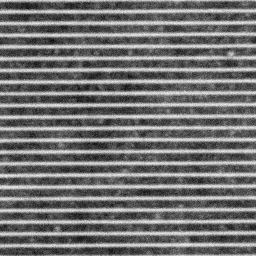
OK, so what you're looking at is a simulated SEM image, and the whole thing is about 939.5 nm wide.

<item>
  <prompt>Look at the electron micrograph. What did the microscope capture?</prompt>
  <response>parallel lines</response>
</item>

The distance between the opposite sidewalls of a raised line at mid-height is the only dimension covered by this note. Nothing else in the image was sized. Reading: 6.9 nm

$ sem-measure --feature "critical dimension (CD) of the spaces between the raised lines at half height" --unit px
9.37